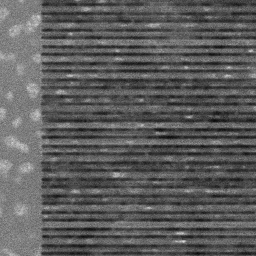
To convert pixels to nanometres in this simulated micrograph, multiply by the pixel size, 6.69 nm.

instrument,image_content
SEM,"parallel lines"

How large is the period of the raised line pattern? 55.6 nm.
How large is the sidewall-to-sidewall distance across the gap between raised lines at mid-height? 0.0251 µm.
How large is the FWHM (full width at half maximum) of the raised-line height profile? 4.56 px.